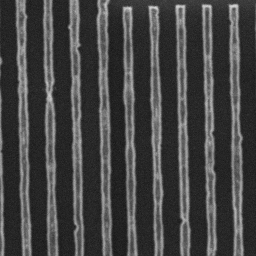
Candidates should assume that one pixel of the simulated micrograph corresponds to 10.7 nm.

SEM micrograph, parallel lines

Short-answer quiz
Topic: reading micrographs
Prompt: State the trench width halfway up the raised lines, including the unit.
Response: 213 nm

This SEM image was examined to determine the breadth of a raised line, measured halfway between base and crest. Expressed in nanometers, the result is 73.7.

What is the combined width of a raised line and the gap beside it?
0.285 micrometres